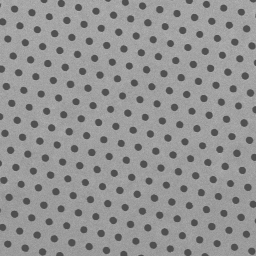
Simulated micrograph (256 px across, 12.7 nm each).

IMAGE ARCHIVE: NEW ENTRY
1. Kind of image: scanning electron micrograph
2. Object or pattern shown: a regular array of holes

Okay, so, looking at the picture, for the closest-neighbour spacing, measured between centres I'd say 224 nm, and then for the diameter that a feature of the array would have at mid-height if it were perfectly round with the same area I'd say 90.9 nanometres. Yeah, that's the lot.